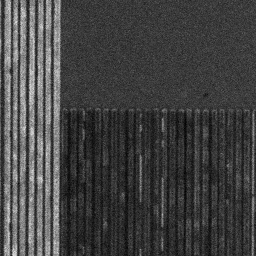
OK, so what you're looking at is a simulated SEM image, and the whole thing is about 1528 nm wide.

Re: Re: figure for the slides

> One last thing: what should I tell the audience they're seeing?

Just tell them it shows parallel lines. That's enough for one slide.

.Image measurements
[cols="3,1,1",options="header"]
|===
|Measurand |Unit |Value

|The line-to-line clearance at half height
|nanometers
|21.6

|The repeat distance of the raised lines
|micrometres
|0.0494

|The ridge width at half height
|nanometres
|26.9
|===